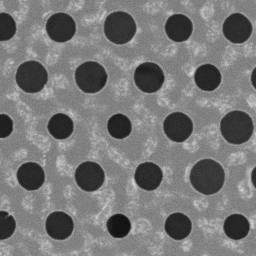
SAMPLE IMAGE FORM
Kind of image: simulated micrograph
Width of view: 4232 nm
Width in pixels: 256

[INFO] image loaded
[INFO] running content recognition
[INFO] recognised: a regular array of holes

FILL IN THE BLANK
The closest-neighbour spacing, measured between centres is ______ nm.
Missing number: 946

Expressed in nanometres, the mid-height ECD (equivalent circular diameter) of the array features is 494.